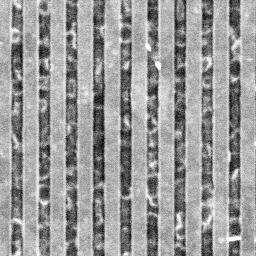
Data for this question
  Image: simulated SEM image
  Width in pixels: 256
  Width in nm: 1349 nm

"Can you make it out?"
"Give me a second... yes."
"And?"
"parallel lines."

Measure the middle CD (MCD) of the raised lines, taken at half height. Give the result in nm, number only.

78.4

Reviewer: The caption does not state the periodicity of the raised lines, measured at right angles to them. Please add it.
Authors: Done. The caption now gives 27.2 px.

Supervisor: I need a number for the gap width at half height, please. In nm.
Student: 67.8